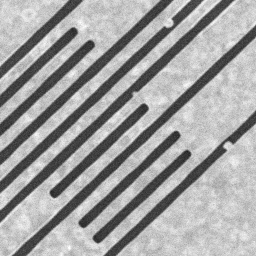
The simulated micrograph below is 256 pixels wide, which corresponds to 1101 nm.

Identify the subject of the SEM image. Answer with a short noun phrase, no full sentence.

groups of lines, slits or small figures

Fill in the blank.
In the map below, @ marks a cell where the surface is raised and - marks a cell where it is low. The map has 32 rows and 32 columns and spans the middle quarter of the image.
---@@@----@@@@----@@@@----@@@@@@
--@@@----@@@@----@@@----@@@@@@@@
-@@@----@@@@----@@@@----@@@@@@@@
@@@----@@@@----@@@@---@@@@@@@@@@
@@----@@@@----@@@@---@@@@@@@@@@@
@----@@@@----@@@----@@@@@@@@@@@@
----@@@@----@@@----@@@@@@@@@@@@-
---@@@@----@@@----@@@@@@@@@@@@--
--@@@@----@@@----@@@@@@@@@@@----
-@@@@---@@@@----@@@@@@@@@@@----@
@@@@---@@@@----@@@@--@@@@@@---@@
@@@---@@@@----@@@@---@@@@----@@@
@@---@@@@----@@@----@@@@----@@@@
@---@@@@----@@@-----@@@----@@@@@
---@@@@----@@@-----@@@----@@@@@@
--@@@@----@@@----@@@@----@@@@@@@
-@@@@----@@@----@@@@----@@@@@@@@
@@@@----@@@----@@@@----@@@@--@@@
@@@---@@@@----@@@@----@@@----@@@
@@---@@@@----@@@@----@@@----@@@@
@---@@@@----@@@@----@@@----@@@@@
---@@@@----@@@@---@@@@----@@@@-@
--@@@@----@@@@---@@@@----@@@@---
-@@@@----@@@@---@@@@----@@@@---@
@@@@----@@@@---@@@@@---@@@@----@
@@@----@@@@---@@@@----@@@@----@@
@@----@@@----@@@@---@@@@@---@@@@
@---@@@@----@@@@----@@@@---@@@@-
---@@@@----@@@@---@@@@@---@@@@--
--@@@@----@@@@---@@@@----@@@@---
-@@@@----@@@@---@@@@----@@@@----
@@@@----@@@@---@@@@----@@@@----@